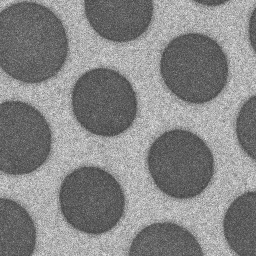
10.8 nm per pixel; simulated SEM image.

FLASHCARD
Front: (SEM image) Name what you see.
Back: holes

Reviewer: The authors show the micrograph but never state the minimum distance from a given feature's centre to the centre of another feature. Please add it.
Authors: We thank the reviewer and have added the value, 1040 nanometers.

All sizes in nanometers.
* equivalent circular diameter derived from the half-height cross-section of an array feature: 731